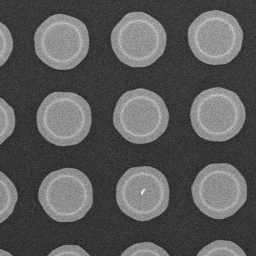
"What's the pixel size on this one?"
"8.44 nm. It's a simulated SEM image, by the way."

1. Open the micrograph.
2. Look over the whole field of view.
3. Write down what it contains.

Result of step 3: an array of small figures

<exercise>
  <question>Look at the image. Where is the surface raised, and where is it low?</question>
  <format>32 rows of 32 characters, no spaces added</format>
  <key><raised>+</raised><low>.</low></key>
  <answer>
................................
..........................++....
......++++.....+++++....+++++...
+....++++++...++++++....++++++..
+...+++++++...+++++++...++++++..
++..+++++++...+++++++...++++++..
+...+++++++...++++++....++++++..
+....+++++.....+++++.....++++...
.......++.......................
................................
................................
................+++......++++...
.....++++++....+++++....++++++..
+....++++++...+++++++...+++++++.
++...++++++...+++++++...+++++++.
++...++++++...+++++++...++++++..
++...++++++....+++++....++++++..
+.....++++......+++.......++....
................................
................................
...........................++...
.......+++......++++.....+++++..
+....++++++....++++++...+++++++.
++...++++++....++++++...+++++++.
++...+++++++...++++++...+++++++.
++...++++++....++++++...++++++..
+.....+++++....+++++.....++++...
+......+++.......++.............
................................
................................
.................++.......+++...
+.....+++++....++++++....+++++..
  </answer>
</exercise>